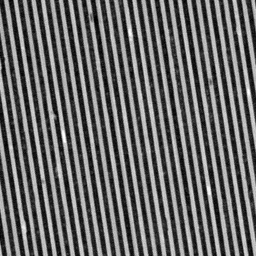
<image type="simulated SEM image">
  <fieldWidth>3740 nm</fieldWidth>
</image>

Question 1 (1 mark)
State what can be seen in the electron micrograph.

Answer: parallel lines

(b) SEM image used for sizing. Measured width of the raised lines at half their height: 0.0505 microns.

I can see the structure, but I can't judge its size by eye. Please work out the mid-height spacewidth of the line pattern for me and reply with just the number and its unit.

74 nm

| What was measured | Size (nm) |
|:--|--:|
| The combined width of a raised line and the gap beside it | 132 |